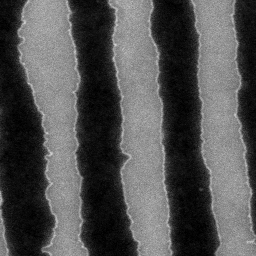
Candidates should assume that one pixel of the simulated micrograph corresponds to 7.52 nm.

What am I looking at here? one or a few lines or trenches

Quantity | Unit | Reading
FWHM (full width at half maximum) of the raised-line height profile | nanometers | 312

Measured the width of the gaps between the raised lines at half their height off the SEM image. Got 0.28 microns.